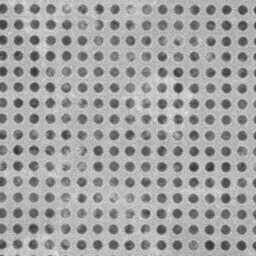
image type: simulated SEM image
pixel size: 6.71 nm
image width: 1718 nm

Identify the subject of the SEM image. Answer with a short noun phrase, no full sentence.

a regular array of holes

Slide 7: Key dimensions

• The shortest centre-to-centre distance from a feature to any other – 103 nanometres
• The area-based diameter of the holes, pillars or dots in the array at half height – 71.8 nm